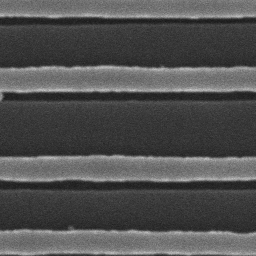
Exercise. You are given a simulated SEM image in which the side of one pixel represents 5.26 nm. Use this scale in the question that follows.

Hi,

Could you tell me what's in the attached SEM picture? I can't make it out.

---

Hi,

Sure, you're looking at lines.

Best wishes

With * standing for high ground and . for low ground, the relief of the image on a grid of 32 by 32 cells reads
********************************
********************************
................................
................................
................................
................................
................................
................................
....****.*******.*...........**.
********************************
********************************
................................
................................
................................
................................
................................
................................
................................
................................
................................
********************************
********************************
..*****....*****...*****........
................................
................................
................................
................................
................................
................................
********************************
********************************
********************************